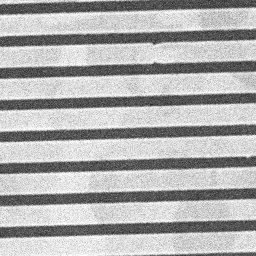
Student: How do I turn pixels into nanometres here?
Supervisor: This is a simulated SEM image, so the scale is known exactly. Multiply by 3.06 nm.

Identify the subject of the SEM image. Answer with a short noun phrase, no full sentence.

parallel lines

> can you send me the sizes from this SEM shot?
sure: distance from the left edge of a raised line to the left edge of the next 97.5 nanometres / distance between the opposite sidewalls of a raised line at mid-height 60.1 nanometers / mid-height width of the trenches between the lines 37.1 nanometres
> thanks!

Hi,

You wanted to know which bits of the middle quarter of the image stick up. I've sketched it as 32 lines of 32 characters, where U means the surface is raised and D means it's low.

DDDDDDDDDDDDDDDDDDDDDDDDDDDDDDDD
DDDDDDDDDDDDDDDDDDDDDDDDDDDDDDDD
DDDDDDDDDDDDDDDDDDDDDDDDDDDDDDDD
DDDDUUUUUUUUUUUUUUUUUUUUUUUUUUUU
UUUUUUUUUUUUUUUUUUUUUUUUUUUUUUUU
UUUUUUUUUUUUUUUUUUUUUUUUUUUUUUUU
UUUUUUUUUUUUUUUUUUUUUUUUUUUUUUUU
UUUUUUUUUUUUUUUUUUUUUUUUUUUDDDDD
DDDDDDDDDDDDDDDDDDDDDDDDDDDDDDDD
DDDDDDDDDDDDDDDDDDDDDDDDDDDDDDDD
DDDDDDDDDDDDDDDDDDDDDDDDDDDDDDDD
UUUUUUUUUUUUUUUUUUUUUUUUUUUUUUUU
UUUUUUUUUUUUUUUUUUUUUUUUUUUUUUUU
UUUUUUUUUUUUUUUUUUUUUUUUUUUUUUUU
UUUUUUUUUUUUUUUUUUUUUUUUUUUUUUUU
UUUUUUUUUUUUUUUUUUUUUUUUDDDDDDDD
DDDDDDDDDDDDDDDDDDDDDDDDDDDDDDDD
DDDDDDDDDDDDDDDDDDDDDDDDDDDDDDDD
DDDDDDDDDDDDDDDDDDDDDDDDDDDDDDDD
UUUUUUUUUUUUUUUUUUUUUUUUUUUUUUUU
UUUUUUUUUUUUUUUUUUUUUUUUUUUUUUUU
UUUUUUUUUUUUUUUUUUUUUUUUUUUUUUUU
UUUUUUUUUUUUUUUUUUUUUUUUUUUUUUUU
UUUUUUUUUUUUUUUUUUUUUDDDDDDDDDDD
DDDDDDDDDDDDDDDDDDDDDDDDDDDDDDDD
DDDDDDDDDDDDDDDDDDDDDDDDDDDDDDDD
DDDDDDDDDDDDDDDDDDDDDDDDDDDDDDUU
UUUUUUUUUUUUUUUUUUUUUUUUUUUUUUUU
UUUUUUUUUUUUUUUUUUUUUUUUUUUUUUUU
UUUUUUUUUUUUUUUUUUUUUUUUUUUUUUUU
UUUUUUUUUUUUUUUUUUUUUUUUUUUUUUUU
UUUUUUUUUUUUUUUUUUDDDDDDDDDDDDDD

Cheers